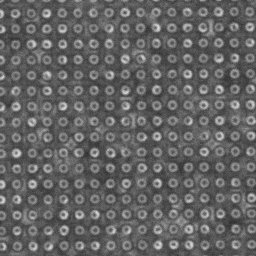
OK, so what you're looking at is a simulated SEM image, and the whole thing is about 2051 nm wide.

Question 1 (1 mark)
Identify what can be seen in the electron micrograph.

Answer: a regular array of raised bodies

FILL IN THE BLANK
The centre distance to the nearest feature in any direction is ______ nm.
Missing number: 120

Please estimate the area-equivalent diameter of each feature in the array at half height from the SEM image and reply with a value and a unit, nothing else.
65.2 nanometers